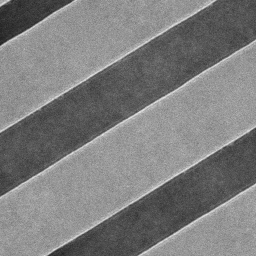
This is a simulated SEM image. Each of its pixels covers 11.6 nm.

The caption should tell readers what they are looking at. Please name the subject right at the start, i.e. lines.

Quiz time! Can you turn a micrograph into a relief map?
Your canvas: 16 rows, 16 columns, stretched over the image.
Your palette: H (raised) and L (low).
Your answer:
LLLLHHHHHHHHHLLL
LLHHHHHHHHHLLLLL
LHHHHHHHHLLLLLLL
HHHHHHHHLLLLLLHH
HHHHHHLLLLLLLHHH
HHHHHLLLLLLHHHHH
HHHLLLLLLHHHHHHH
HLLLLLLLHHHHHHHH
LLLLLLHHHHHHHHHL
LLLLLHHHHHHHHLLL
LLLHHHHHHHHHLLLL
LHHHHHHHHHLLLLLL
HHHHHHHHHLLLLLHH
HHHHHHHLLLLLLHHH
HHHHHLLLLLLHHHHH
HHHHLLLLLHHHHHHH